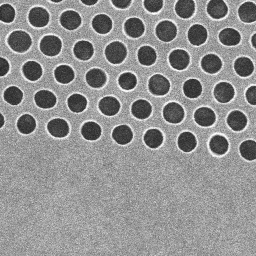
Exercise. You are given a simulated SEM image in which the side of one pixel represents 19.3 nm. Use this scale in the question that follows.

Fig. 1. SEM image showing a regular array of holes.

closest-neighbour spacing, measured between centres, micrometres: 0.594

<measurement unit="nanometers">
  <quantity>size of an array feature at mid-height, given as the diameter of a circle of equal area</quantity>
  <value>401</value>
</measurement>